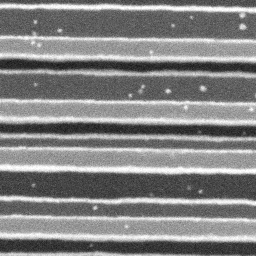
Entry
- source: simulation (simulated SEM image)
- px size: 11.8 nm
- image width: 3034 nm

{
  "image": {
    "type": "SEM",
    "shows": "lines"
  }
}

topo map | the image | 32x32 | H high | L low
LLLLLLLLLLLLLLLLLLLLLLLLLLLLLLLL
HHHHHHHHHHHHHHHHHHHHHHHHHHHHHHHH
HHHHHHHHHHHHHHHHHHHHHHHHHHHHHHHH
HHHHHHHHHHHHHHHHHHHHHHHHHHHHHHHH
HHHHHHHHHHHHHHHHHHHHHHHHHHHHHHHH
HHHHHHHHHHHHHHHHHHHHHHHHHHHHHHHH
HHHHHHHHHHHHHHHHHHHHHHHHHHHHHHHH
LLLLLLLLLLLLLLLLLLLLLLLLLLLLLLLH
LLLLLLLLLLLLLLLLLLLLLLLLLLLLLLLL
HHHHHHHHHHHHHHHHHHHHHHHHHHHHHHHL
HHHHHHHHHHHHHHHHHHHHHHHHHHHHHHHH
HHHHHHHHHHHHHHHHHHHHHHHHHHHHHHHH
HHHHHHHHHHHHHHHHHHHHHHHHHHHHHHHH
HHHHHHHHHHHHHHHHHHHHHHHHHHHHHHHH
HHHHHHHHHHHHHHHHHHHHHHHHHHHHHHHH
LLLLLLLLLLLLLLLLLLLLLLLLLLLLLLLL
LLLLLLLLLLLLLLLLLLLLLLLLLLLLLLLL
HHHHHHHHHHHHHHHHHHHHHHHHHHHHHHHH
HHHHHHHHHHHHHHHHHHHHHHHHHHHHHHHH
HHHHHHHHHHHHHHHHHHHHHHHHHHHHHHHH
HHHHHHHHHHHHHHHHHHHHHHHHHHHHHHHH
LLLLLLLLLLLLLLLLLLLLLLLLLLLLLLLL
LLLLLLLLLLLLLLLLLLLLLLLLLLLLLLLL
LLLLLLLLLLLLLLLLLLLLLLLLLLLLLLLL
LLLLLLLLLLLLLLLLLLLLLLLLLLLLLLLL
HHHHHHHHHHHHHHHHHHHHHHHHHHHHHHHH
HHHHHHHHHHHHHHHHHHHHHHHHHHHHHHHH
HHHHHHHHHHHHHHHHHHHHHHHHHHHHHHHH
HHHHHHHHHHHHHHHHHHHHHHHHHHHHHHHH
LHLLLHHHHHHHHHHHHHHHHHHHHHHHHHHH
LLLLLLLLLLLLLLLLLLLLLLLLLLLLLLLL
LLLLLLLLLLLLLLLLLLLLLLLLLLLLLLLL